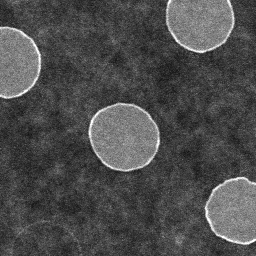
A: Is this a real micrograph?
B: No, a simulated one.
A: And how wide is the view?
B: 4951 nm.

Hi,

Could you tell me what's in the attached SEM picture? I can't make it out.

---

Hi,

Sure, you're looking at raised bodies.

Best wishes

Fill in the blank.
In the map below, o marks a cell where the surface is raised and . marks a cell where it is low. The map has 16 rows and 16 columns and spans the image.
..........oooo..
..........ooooo.
oo.........ooo..
oo..............
oo..............
oo..............
................
......oooo......
......oooo......
......oooo......
.......oo.......
..............oo
.............ooo
.............ooo
.............ooo
................